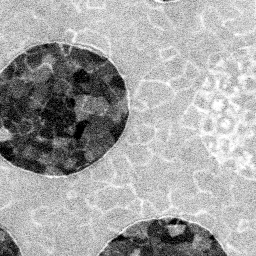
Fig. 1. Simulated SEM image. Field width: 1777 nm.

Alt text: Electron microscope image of raised bodies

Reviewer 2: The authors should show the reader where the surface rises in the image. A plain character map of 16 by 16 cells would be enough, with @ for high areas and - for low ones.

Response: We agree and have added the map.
----------------
----------------
-----@----------
-@@@@@@---------
@@@@@@@---------
@@@@@@@@--------
@@@@@@@@--------
@@@@@@@@--------
@@@@@@@@--------
@@@@@@@---------
-@@@@-----------
----------------
----------------
----------------
--------@@@@@---
@-----@@@@@@@@--